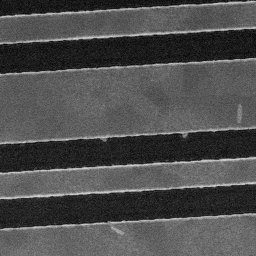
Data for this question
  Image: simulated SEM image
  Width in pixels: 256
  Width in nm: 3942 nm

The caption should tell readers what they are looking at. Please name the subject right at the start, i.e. lines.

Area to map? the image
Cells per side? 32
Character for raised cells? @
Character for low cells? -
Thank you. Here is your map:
---------------------------@@@@@
-----------@@@@@@@@@@@@@@@@@@@@@
@@@@@@@@@@@@@@@@@@@@@@@@@@@@@@@@
@@@@@@@@@@@@@@@@@@@@@@@@@@@@@@@@
@@@@@@@@@@@@@@@-----------------
--------------------------------
--------------------------------
-----------------------------@@@
-------------@@@@@@@@@@@@@@@@@@@
@@@@@@@@@@@@@@@@@@@@@@@@@@@@@@@@
@@@@@@@@@@@@@@@@@@@@@@@@@@@@@@@@
@@@@@@@@@@@@@@@@@@@@@@@@@@@@@@@@
@@@@@@@@@@@@@@@@@@@@@@@@@@@@@@@@
@@@@@@@@@@@@@@@@@@@@@@@@@@@@@@@@
@@@@@@@@@@@@@@@@@@@@@@@@@@@@@@@@
@@@@@@@@@@@@@@@@@@@@@@@@@@@@@@@@
@@@@@@@@@@@@@@@@@@@@@@@@--------
@@@@@@@@@-----------------------
--------------------------------
--------------------------------
--------------------@@@@@@@@@@@@
---@@@@@@@@@@@@@@@@@@@@@@@@@@@@@
@@@@@@@@@@@@@@@@@@@@@@@@@@@@@@@@
@@@@@@@@@@@@@@@@@@@@@@@---------
@@@@@---------------------------
--------------------------------
--------------------------------
-------------------@@@@@@@@@@@@@
--@@@@@@@@@@@@@@@@@@@@@@@@@@@@@@
@@@@@@@@@@@@@@@@@@@@@@@@@@@@@@@@
@@@@@@@@@@@@@@@@@@@@@@@@@@@@@@@@
@@@@@@@@@@@@@@@@@@@@@@@@@@@@@@@@